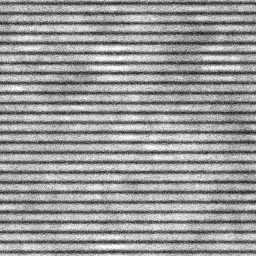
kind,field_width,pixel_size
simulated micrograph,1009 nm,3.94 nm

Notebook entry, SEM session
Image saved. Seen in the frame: parallel lines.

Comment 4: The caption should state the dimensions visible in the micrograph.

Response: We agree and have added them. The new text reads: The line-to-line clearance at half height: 13.3 nm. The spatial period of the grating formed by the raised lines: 39.2 nanometres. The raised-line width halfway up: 26.6 nanometres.